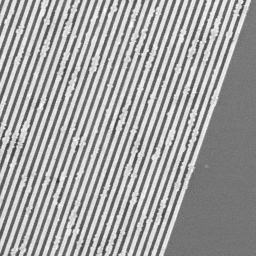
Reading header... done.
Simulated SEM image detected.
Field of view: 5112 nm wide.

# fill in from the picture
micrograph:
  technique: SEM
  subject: parallel lines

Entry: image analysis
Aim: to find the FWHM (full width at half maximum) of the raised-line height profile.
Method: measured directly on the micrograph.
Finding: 73.3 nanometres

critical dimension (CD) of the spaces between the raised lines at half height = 73.3 nanometres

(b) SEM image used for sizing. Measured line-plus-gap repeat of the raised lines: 147 nanometres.